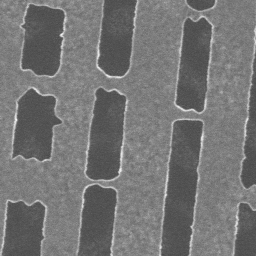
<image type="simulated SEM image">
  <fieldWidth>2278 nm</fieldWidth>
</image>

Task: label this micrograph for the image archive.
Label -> one or a few lines or trenches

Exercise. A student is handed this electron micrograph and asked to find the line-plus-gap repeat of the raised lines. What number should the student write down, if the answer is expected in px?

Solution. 76.7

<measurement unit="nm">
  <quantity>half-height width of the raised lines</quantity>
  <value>396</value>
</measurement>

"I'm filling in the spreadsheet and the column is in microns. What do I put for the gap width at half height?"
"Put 0.286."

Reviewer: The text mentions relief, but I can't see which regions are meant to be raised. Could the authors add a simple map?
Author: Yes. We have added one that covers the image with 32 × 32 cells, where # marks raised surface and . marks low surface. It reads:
#############....######....#####
###.....#####....###############
###.....#####....######.#.######
###.....#####....######...######
###.....#####....######...######
###.....####.....######...######
###.....####....#######...######
###.....####....#######...######
###....######...######....######
##############.#######....######
######################....#####.
###..#######...#######....#####.
##.....#####....######....#####.
##.....#####....#######..######.
##.....#####....###############.
##.....####....#######...######.
##.....####....#######...######.
##.....####....#######...######.
##.....####....######....#####..
##....#####....######....######.
###########....######....#####..
###########....######....#####..
#############.#######....#####..
###########...#######....#######
##########.....######...########
#..#.#####.....######...######.#
#.....####....######....######..
#.....####....######....######..
#....#####....######....######..
#....#####....######....#####...
.....#####....######....#####...
.....#####....######....#####...